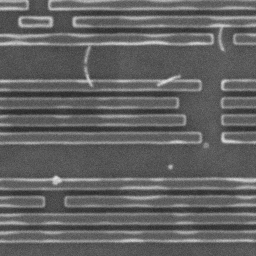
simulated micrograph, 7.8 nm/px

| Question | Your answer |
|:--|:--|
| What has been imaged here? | groups of lines, slits or small figures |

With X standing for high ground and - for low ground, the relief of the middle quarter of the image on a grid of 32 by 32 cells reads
--------------------------------
--------------------------------
--------------------------------
--------------------------------
XXXXXXXXXXXXXXXXXXXXXXXXXXXXXXXX
XXXXXXXXXXXXXXXXXXXXXXXXXXXXXXXX
---XXXXXX-----------------------
--------------------------------
------XX--------XXXXX-----XX----
XXXXXXXXXXXXXXXXXXXXXXXXXXXXX---
XXXXXXXXXXXXXXXXXXXXXXXXXXXXX---
--------------------------------
--------------------------------
XXXXXXXXXXXXXXXXXXXXXXXXXXXXXX--
XXXXXXXXXXXXXXXXXXXXXXXXXXXXXX--
--------------------------------
--------------------------------
XXXXXXXXXXXXXXXXXXXXXXXXXXXXXXXX
XXXXXXXXXXXXXXXXXXXXXXXXXXXXXXXX
XXXXXXXXXXXXXXXXXXXXXXXXXXXXXXXX
--------------------------------
--------------------------------
--------------------------------
--------------------------------
--------------------------------
--------------------------------
--------------------------------
--------------------------------
--------------------------------
XXXXXXXXXXXXXXXXXXXXXXXXXXXXXXXX
XXXXXXXXXXXXXXXXXXXXXXXXXXXXXXXX
--------------------------------